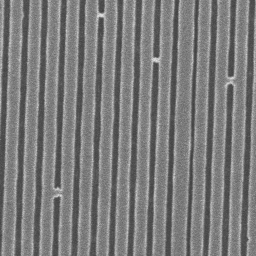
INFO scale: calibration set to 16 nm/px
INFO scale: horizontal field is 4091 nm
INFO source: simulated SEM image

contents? parallel lines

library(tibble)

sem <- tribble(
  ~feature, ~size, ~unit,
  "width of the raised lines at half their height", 204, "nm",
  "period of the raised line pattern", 301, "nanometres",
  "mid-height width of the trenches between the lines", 102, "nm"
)